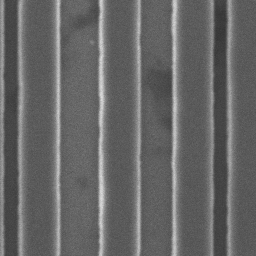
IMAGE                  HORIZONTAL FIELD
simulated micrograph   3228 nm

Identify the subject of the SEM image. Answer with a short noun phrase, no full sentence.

lines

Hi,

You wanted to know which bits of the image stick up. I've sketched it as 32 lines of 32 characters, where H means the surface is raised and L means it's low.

LLHHHHHLLLLLLHHHHLLLLLHHHHHLLHHH
LLHHHHHLLLLLLHHHHLLLLLHHHHHLLHHH
LLHHHHHLLLLLLHHHHLLLLLHHHHHLLHHH
LLHHHHHLLLLLLHHHHLLLLLHHHHHLLHHH
LLHHHHHLLLLLLHHHHLLLLLHHHHHLLHHH
LLHHHHHLLLLLLHHHHLLLLLHHHHHLLHHH
LLHHHHHLLLLLLHHHHLLLLLHHHHHLLHHH
LLHHHHHLLLLLLHHHHLLLLLHHHHHLHHHH
LLHHHHHLLLLLLHHHHLLLLLHHHHHLLHHH
LLHHHHHLLLLLLHHHHLLLLLHHHHHLLHHH
LLHHHHHLLLLLLHHHHLLLLLHHHHHLLHHH
LLHHHHHLLLLLLHHHHLLLLLHHHHHLLHHH
LLHHHHHLLLLLLHHHHLLLLLHHHHHLLHHH
LLHHHHHLLLLLLHHHHLLLLLHHHHHLLHHH
LLHHHHHLLLLLLHHHHLLLLLHHHHHLLHHH
LLHHHHHLLLLLLHHHHLLLLLHHHHHLLHHH
LLHHHHHLLLLLLHHHHLLLLLHHHHHLLHHH
LLHHHHHLLLLLLHHHHLLLLLHHHHHLLHHH
LLHHHHHLLLLLHHHHHLLLLLHHHHHLLHHH
LLHHHHHLLLLLLHHHHLLLLLHHHHHLLHHH
LLHHHHHLLLLLLHHHHLLLLLHHHHHLLHHH
LLHHHHHLLLLLLHHHHLLLLLHHHHHLLHHH
LLHHHHHLLLLLLHHHHLLLLLHHHHHLLHHH
LLHHHHHLLLLLLHHHHLLLLLHHHHHLLHHH
LLHHHHHLLLLLLHHHHLLLLLHHHHHLLHHH
LLHHHHHLLLLLLHHHHLLLLLHHHHHLLHHH
LLHHHHHLLLLLLHHHHLLLLLHHHHHLLHHH
LLHHHHHLLLLLLHHHHLLLLLHHHHHLLHHH
LLHHHHHLLLLLLHHHHLLLLLHHHHHLLHHH
LLHHHHHLLLLLLHHHHLLLLLHHHHHLLHHH
LLHHHHHLLLLLLHHHHLLLLLHHHHHLLHHH
LLHHHHHLLLLLLHHHHLLLLLHHHHHLLHHH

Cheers